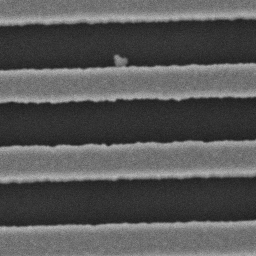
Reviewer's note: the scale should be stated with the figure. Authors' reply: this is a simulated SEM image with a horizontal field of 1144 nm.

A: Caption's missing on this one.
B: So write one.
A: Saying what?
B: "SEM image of lines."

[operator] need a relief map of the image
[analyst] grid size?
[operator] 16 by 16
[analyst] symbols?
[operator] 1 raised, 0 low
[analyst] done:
1111111111111111
1000000000000000
0000000000000000
0000000000000000
1111111111111111
1111111111111111
0000000000000000
0000000000000000
0000000000000000
1111111111111111
1111111111111111
0000000000000000
0000000000000000
0000000000000000
1111111111111111
1111111111111111